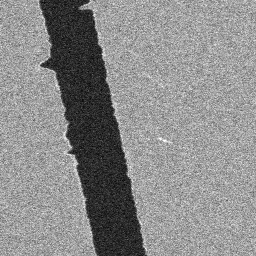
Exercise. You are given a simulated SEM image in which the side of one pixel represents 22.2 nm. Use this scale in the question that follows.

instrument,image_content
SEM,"one or a few lines or trenches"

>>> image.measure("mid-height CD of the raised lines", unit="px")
50.5